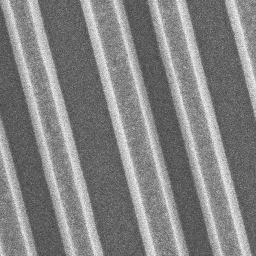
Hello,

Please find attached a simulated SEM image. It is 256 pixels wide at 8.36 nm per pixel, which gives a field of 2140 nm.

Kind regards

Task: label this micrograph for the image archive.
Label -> one or a few lines or trenches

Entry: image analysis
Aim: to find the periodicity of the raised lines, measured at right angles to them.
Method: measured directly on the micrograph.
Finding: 597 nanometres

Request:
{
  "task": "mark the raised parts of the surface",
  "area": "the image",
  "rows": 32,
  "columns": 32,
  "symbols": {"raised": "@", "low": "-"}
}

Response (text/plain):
-@@@-------@@@@----@@@@------@@@
-@@@@------@@@@----@@@@------@@@
-@@@@------@@@@-----@@@------@@@
-@@@@------@@@@@----@@@@------@@
--@@@-------@@@@----@@@@------@@
--@@@@------@@@@----@@@@------@@
--@@@@------@@@@-----@@@------@@
--@@@@------@@@@@----@@@@------@
---@@@-------@@@@----@@@@------@
---@@@@------@@@@----@@@@------@
---@@@@------@@@@@----@@@------@
----@@@-------@@@@----@@@@------
----@@@-------@@@@----@@@@------
----@@@@------@@@@----@@@@------
----@@@@------@@@@@----@@@------
----@@@@-------@@@@----@@@@-----
-----@@@@------@@@@----@@@@-----
-----@@@@------@@@@----@@@@-----
@----@@@@------@@@@@----@@@@----
@-----@@@-------@@@@----@@@@----
@-----@@@@------@@@@----@@@@----
@-----@@@@------@@@@-----@@@----
@@----@@@@------@@@@@----@@@@---
@@-----@@@-------@@@@----@@@@---
@@-----@@@@------@@@@----@@@@---
@@@----@@@@------@@@@-----@@@---
@@@----@@@@------@@@@@----@@@@--
@@@-----@@@-------@@@@----@@@@--
@@@-----@@@@------@@@@----@@@@--
@@@@----@@@@------@@@@-----@@@--
@@@@----@@@@------@@@@@----@@@@-
@@@@-----@@@-------@@@@----@@@@-